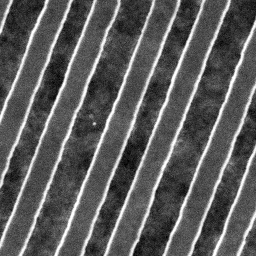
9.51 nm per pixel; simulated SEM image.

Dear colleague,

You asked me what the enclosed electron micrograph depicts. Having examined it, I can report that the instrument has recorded lines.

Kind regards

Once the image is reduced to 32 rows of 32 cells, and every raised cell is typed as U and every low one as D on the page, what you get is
UDDDDDUUUDDDUUUDDDDUUUDDDUUUUDDD
UDDDDUUUUDDUUUUDDDDUUUDDDUUUDDDD
UDDDDUUUDDDUUUDDDDUUUUDDDUUUDDDD
DDDDUUUUDDDUUUDDDDUUUDDDUUUDDDDD
DDDDUUUDDDUUUDDDDDUUUDDDUUUDDDDU
DDDDUUUDDDUUUDDDDUUUDDDUUUUDDDDU
DDDUUUDDDUUUUDDDDUUUDDDUUUDDDDUU
DDDUUUDDDUUUDDDDUUUUDDDUUUDDDDUU
DDDUUUDDDUUUDDDDUUUDDDUUUUDDDDUU
DDUUUDDDUUUDDDDDUUUDDDUUUDDDDUUU
DDUUUDDDUUUDDDDUUUUDDUUUUDDDDUUU
DUUUDDDUUUUDDDDUUUDDDUUUDDDDDUUU
DUUUDDDUUUDDDDDUUUDDDUUUDDDDUUUD
DUUUDDDUUUDDDDUUUDDDUUUUDDDDUUUD
UUUUDDUUUDDDDDUUUDDDUUUDDDDUUUUD
UUUDDDUUUDDDDUUUUDDDUUUDDDDUUUDD
UUUDDUUUUDDDDUUUDDDUUUDDDDDUUUDD
UUDDDUUUDDDDDUUUDDDUUUDDDDUUUDDD
UUDDDUUUDDDDUUUUDDUUUUDDDDUUUDDD
UDDDUUUUDDDDUUUDDDUUUDDDDUUUUDDU
UDDDUUUDDDDUUUUDDDUUUDDDDUUUDDDU
UDDDUUUDDDDUUUDDDUUUDDDDDUUUDDDU
DDDUUUDDDDDUUUDDDUUUDDDDUUUUDDUU
DDDUUUDDDDUUUUDDUUUUDDDDUUUDDDUU
DDUUUUDDDDUUUDDDUUUDDDDUUUUDDDUU
DDUUUDDDDUUUUDDDUUUDDDDUUUDDDUUU
DDUUUDDDDUUUDDDUUUUDDDDUUUDDDUUU
DUUUDDDDDUUUDDDUUUDDDDUUUUDDUUUU
DUUUDDDDUUUUDDUUUUDDDDUUUDDDUUUD
UUUUDDDDUUUDDDUUUDDDDUUUUDDDUUUD
UUUDDDDDUUUDDDUUUDDDDUUUDDDUUUUD
UUUDDDDUUUUDDUUUUDDDDUUUDDDUUUDD